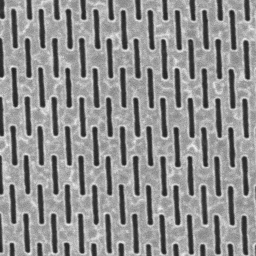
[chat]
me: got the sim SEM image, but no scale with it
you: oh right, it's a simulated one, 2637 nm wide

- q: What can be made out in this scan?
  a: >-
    a regular array of holes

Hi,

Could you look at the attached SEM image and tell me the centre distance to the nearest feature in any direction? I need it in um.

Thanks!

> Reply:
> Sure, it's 0.279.